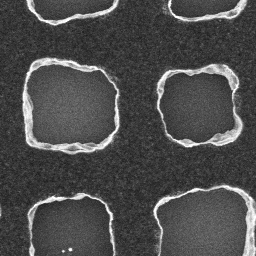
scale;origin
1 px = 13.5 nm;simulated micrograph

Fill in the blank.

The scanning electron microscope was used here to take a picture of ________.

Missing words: holes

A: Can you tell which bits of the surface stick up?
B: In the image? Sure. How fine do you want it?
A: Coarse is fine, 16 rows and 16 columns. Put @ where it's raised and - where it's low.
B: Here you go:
@@-----@@@@----@
@@@@@@@@@@@@@@@@
@@@@@@@@@@@@@@@@
@@@@@@@@@@@@@@@@
@@----@@@@@-@@@@
@@-----@@@----@@
@@-----@@@-----@
@@-----@@@-----@
@@-----@@@@---@@
@@@@@@@@@@@@@@@@
@@@@@@@@@@@@@@@@
@@@@@@@@@@@@@@@@
@@@@--@@@@@----@
@@-----@@@------
@@-----@@@------
@@-----@@@-----@